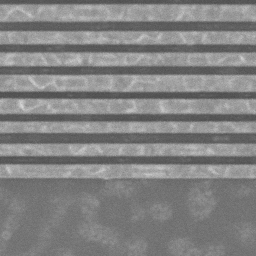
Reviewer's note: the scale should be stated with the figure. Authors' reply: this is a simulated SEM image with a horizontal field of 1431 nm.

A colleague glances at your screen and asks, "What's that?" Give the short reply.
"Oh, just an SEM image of parallel lines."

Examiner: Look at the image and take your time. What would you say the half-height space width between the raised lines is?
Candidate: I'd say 49.6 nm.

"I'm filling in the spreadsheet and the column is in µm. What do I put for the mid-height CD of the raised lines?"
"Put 0.0712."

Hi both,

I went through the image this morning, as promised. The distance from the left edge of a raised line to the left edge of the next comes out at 126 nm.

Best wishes